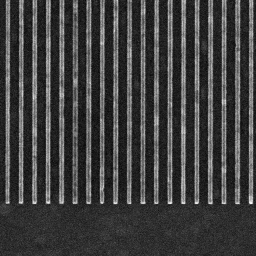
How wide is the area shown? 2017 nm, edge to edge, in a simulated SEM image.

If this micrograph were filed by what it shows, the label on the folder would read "parallel lines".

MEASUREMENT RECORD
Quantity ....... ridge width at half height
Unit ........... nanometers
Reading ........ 27.6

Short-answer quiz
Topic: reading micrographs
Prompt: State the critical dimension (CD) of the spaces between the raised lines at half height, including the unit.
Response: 81.7 nm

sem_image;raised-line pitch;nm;106